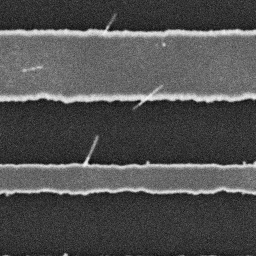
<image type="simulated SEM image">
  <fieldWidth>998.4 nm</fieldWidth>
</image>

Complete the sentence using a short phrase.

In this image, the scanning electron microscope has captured lines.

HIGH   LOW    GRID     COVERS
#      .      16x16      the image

................
................
################
################
################
################
................
................
................
................
################
################
................
................
................
................